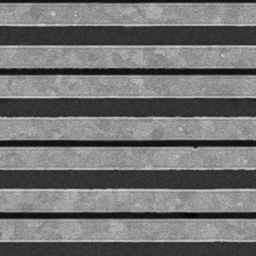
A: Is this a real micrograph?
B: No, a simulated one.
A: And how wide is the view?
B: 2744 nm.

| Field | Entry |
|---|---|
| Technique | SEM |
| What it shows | parallel lines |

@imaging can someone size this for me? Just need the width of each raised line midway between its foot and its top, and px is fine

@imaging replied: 22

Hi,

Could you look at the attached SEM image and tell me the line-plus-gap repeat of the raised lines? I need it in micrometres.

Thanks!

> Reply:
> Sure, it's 0.386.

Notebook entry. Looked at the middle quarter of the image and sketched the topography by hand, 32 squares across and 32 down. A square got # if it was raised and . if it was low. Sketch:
################################
................................
................................
################################
################################
################################
################################
################################
................................
................................
................................
................................
................................
################################
################################
################################
################################
################################
################################
................................
................................
################################
################################
################################
################################
################################
................................
................................
................................
................................
................................
................###.............